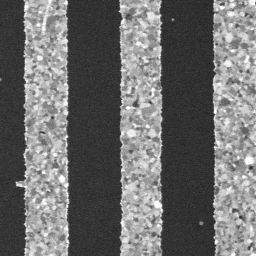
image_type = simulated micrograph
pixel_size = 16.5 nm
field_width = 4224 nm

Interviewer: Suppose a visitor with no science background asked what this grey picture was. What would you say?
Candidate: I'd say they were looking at one or a few lines or trenches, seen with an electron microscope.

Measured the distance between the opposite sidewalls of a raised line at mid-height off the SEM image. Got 666 nanometres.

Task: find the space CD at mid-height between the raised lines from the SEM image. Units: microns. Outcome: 0.895